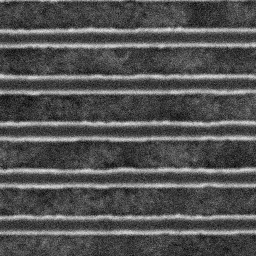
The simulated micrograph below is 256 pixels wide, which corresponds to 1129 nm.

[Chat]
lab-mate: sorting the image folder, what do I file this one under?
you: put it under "lines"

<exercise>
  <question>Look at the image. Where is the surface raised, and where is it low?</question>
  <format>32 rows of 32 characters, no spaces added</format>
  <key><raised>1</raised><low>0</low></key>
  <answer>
00000000000000000000000000000000
00000000000000000000000000000000
00000000000000000000000000000000
00000000000000000000000000000000
11111111111111111111111111111111
11111111111111111111111111111111
00000000000000000000000000000000
00000000000000000000000000000000
00000000000000000000000000000000
10000000000110000111111111111111
11111111111111111111111111111111
11111111111111111111111111111111
00000000000000000000000000000000
00000000000000000000000000000000
00000000000000000000000000000000
11111111111111111111111111111111
11111111111111111111111111111111
01111111110001111110000000000000
00000000000000000000000000000000
00000000000000000000000000000000
00000000000000000000000000000000
11111111111111111111111111111111
11111111111111111111111111111111
00000000000000000000000000000000
00000000000000000000000000000000
00000000000000000000000000000000
00000000000000000000000000000000
11111111111111111111111111111111
11111111111111111111111111111111
00000000000000000000000000000000
00000000000000000000000000000000
00000000000000000000000000000000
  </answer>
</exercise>